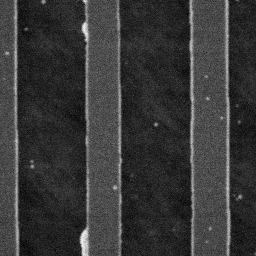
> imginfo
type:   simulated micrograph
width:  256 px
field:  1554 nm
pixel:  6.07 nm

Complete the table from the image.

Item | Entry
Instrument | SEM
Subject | lines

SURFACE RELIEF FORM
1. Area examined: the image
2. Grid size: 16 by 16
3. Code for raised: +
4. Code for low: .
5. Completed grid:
+....++.....++..
+....++.....++..
+....++.....++..
+....++.....++..
+....++.....++..
+....+++....++..
+....+++....++..
+....+++....++..
+....+++....++..
+....+++....++..
+....+++....++..
+....+++....++..
+....+++....++..
+....+++....++..
+....+++....++..
+....+++....++..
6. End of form